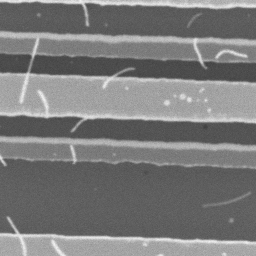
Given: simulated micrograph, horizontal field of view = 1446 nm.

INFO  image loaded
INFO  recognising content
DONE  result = lines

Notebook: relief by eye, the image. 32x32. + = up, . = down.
.............+++++++++++++++++++
................................
................................
................................
+++++++++.......................
++++++++++++++++++++++++++++++++
++++++++++++++++++++++++++++++++
........................++++++++
................................
++++++++++......................
++++++++++++++++++++++++++++++++
++++++++++++++++++++++++++++++++
++++++++++++++++++++++++++++++++
++++++++++++++++++++++++++++++++
.....+....++++++++++++++++++++++
................................
................................
++++++..........................
++++++++++++++++++++++++++++++++
++++++++++++++++++++++++++++++++
...................+++++++++++++
................................
................................
................................
................................
................................
................................
................................
................................
+++++++.........................
++++++++++++++++++++++++++++++++
++++++++++++++++++++++++++++++++